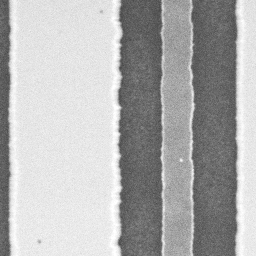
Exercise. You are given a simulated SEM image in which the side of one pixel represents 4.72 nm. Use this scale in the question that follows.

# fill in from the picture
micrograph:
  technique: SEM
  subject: lines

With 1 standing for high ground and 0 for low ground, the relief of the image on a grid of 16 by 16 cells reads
0111111000110001
0111111000110001
0111111100110001
0111111000110001
0111111000110001
0111111000110001
0111111000110001
0111111000110001
0111111000110001
0111111000110001
0111111000110001
0111111000110001
0111111000110001
0111111000110001
0111111000110001
0111111000110001